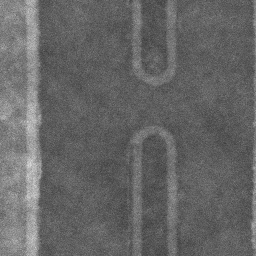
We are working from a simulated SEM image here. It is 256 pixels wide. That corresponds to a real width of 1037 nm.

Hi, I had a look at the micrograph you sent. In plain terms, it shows one or a few lines or trenches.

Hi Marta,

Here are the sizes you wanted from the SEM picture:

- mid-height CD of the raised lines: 144 nanometers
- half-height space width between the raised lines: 423 nanometres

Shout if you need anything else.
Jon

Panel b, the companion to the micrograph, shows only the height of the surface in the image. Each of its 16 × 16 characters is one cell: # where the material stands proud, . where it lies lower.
##.......##.....
##.......##.....
##.......##.....
##.......##.....
##.......##.....
##..............
##..............
##..............
##.......#......
##.......##.....
##.......##.....
##.......##.....
##.......##.....
##.......##.....
##.......##.....
##.......##.....